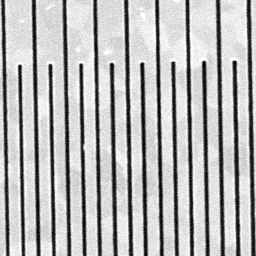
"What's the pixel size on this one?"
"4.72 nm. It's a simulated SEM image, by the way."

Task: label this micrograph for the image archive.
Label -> parallel lines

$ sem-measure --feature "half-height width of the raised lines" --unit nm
50.2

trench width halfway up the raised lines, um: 0.0212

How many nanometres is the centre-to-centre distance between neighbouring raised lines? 72.5